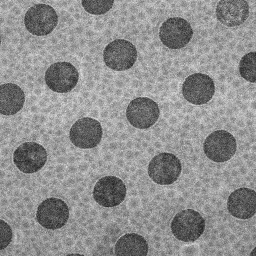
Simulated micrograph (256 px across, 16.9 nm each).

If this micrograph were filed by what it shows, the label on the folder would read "a regular array of holes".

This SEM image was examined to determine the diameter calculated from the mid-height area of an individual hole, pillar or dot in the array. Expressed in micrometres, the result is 0.569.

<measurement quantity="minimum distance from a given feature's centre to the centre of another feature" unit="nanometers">1020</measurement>